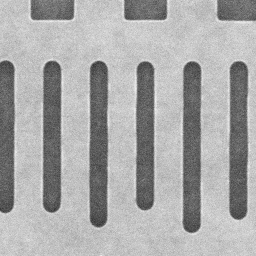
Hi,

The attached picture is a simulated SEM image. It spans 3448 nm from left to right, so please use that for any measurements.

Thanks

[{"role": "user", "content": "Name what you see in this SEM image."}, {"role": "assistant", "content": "groups of lines, slits or small figures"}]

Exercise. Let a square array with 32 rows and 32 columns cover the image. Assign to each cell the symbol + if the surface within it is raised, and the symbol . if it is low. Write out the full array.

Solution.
++++.....++++++......++++++.....
++++.....++++++......++++++.....
++++.....+++++++.....++++++.....
++++++++++++++++++++++++++++++++
++++++++++++++++++++++++++++++++
++++++++++++++++++++++++++++++++
++++++++++++++++++++++++++++++++
++++++++++++++++++++++++++++++++
..+++...+++...+++..++++..++++..+
..+++...+++...+++..++++..++++..+
..+++...+++...+++..++++..++++..+
..+++...+++...+++..++++..++++..+
..+++...+++...+++..++++..++++..+
..+++...+++...+++..++++..++++..+
..+++...+++...+++..++++..++++..+
..+++...+++...+++..++++..++++..+
..+++...+++...+++..++++..++++..+
..+++...+++...+++..++++..++++..+
..+++...+++...+++..++++..+++...+
..+++...+++...+++..++++..+++...+
..+++...+++...+++..++++..+++...+
..+++...+++...+++..++++..+++...+
..+++...+++...+++..++++..+++...+
..+++...+++...+++..++++..+++...+
..+++...+++...+++..++++..+++...+
..+++...+++...+++..++++..+++...+
.+++++.++++...+++++++++..++++..+
+++++++++++..++++++++++..++++.++
+++++++++++++++++++++++..+++++++
++++++++++++++++++++++++++++++++
++++++++++++++++++++++++++++++++
++++++++++++++++++++++++++++++++